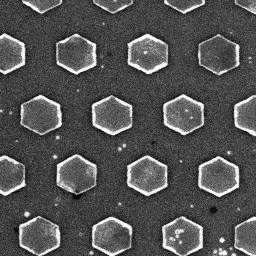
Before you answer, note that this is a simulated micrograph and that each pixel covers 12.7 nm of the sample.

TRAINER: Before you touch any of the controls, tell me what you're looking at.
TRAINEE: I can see a regular array of raised bodies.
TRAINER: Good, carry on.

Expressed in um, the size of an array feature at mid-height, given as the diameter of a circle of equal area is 0.492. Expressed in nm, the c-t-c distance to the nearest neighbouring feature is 882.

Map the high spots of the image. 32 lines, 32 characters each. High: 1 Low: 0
00011110000011110000011110000011
00000000000000000000000000000000
00000000000000000000000000000000
00000000000000000000000000000000
10000000010000000010000000010000
11100001111100001111100001111100
11100001111100001111100001111100
11100001111100001111100001111100
11000000111000000111000000111000
00000000000000000000000000000000
00000000000000000000000000000000
00000000000000000000000000000000
00001100000001100000001100000001
00011110000011110000011110000111
00011111000011110000011110000111
00011111000011110000011110000111
00001100000001100000001100000001
00000000000000000000000000000000
00000000000000000000000000000000
00000000010000000000000000000000
11100001111100001111000001111000
11100001111100001111100001111100
11100001111100001111100001111100
11000000111000000111000001111000
00000000000000000000000000000000
00000000000000000000000000000000
00000000000000000000000000000000
00001100000001100000001100000001
00011110000011110000111110000011
00011110000011110000111110000111
00011110000011110000111110000111
00001100000001100000001100000001